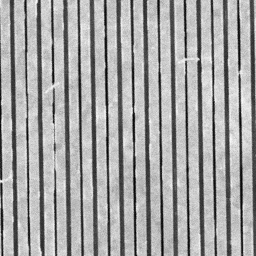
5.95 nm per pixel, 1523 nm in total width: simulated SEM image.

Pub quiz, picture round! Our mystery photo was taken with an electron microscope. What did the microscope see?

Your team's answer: parallel lines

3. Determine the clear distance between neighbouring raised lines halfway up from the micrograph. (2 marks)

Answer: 22.3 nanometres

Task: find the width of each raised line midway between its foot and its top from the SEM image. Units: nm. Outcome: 56.5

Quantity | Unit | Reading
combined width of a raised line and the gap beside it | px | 13.3